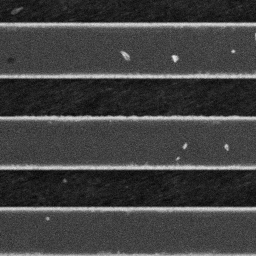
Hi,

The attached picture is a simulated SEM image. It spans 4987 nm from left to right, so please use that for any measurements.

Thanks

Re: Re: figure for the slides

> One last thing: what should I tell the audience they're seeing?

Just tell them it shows lines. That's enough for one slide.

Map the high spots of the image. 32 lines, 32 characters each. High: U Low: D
DDDDDDDDDDDDDDDDDDDDDDDDDDDDDDDD
DDDDDDDDDDDDDDDDDDDDDDDDDDDDDDDD
DDDDDDDDDDDDDDDDDDDDDDDDDDDDDDDD
UUUUUUUUUUUUUUUUUUUUUUUUUUUUUUUU
UUUUUUUUUUUUUUUUUUUUUUUUUUUUUUUU
UUUUUUUUUUUUUUUUUUUUUUUUUUUUUUUU
UUUUUUUUUUUUUUUUUUUUUUUUUUUUUUUU
UUUUUUUUUUUUUUUUUUUUUUUUUUUUUUUU
UUUUUUUUUUUUUUUUUUUUUUUUUUUUUUUU
UUUUUUUUUUUUUUUUUUUUUUUUUUUUUUUU
DDDDDDDDDDDDDDDDDDDDDDDDDDDDDDDD
DDDDDDDDDDDDDDDDDDDDDDDDDDDDDDDD
DDDDDDDDDDDDDDDDDDDDDDDDDDDDDDDD
DDDDDDDDDDDDDDDDDDDDDDDDDDDDDDDD
DDDDDDDDDDDDDDDDDDDDDDDDDDDDDDDD
UUUUUUUUUUUUUUUUUUUUUUUUUUUUUUUU
UUUUUUUUUUUUUUUUUUUUUUUUUUUUUUUU
UUUUUUUUUUUUUUUUUUUUUUUUUUUUUUUU
UUUUUUUUUUUUUUUUUUUUUUUUUUUUUUUU
UUUUUUUUUUUUUUUUUUUUUUUUUUUUUUUU
UUUUUUUUUUUUUUUUUUUUUUUUUUUUUUUU
DDDDDDDDDDDDDDDDDDDDDDDDDDDDDDDD
DDDDDDDDDDDDDDDDDDDDDDDDDDDDDDDD
DDDDDDDDDDDDDDDDDDDDDDDDDDDDDDDD
DDDDDDDDDDDDDDDDDDDDDDDDDDDDDDDD
DDDDDDDDDDDDDDDDDDDDDDDDDDDDDDDD
UUUUUUUUUUUUUUUUUUUUUUUUUUUUUUUU
UUUUUUUUUUUUUUUUUUUUUUUUUUUUUUUU
UUUUUUUUUUUUUUUUUUUUUUUUUUUUUUUU
UUUUUUUUUUUUUUUUUUUUUUUUUUUUUUUU
UUUUUUUUUUUUUUUUUUUUUUUUUUUUUUUU
UUUUUUUUUUUUUUUUUUUUUUUUUUUUUUUU